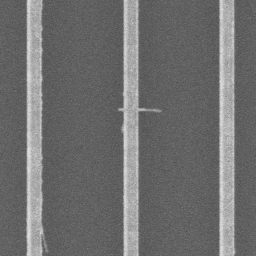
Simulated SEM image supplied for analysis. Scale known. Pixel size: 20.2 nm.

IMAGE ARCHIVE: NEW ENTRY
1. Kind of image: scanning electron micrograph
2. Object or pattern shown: lines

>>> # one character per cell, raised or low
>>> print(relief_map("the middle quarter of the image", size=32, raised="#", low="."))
...............###..............
...............###..............
...............###..............
...............###..............
...............###..............
...............###..............
...............###..............
...............###..............
...............###..............
...............###..............
...............###..............
..............#####.............
...............###..............
...............###..............
...............###..............
...............###..............
...............###..............
...............###..............
...............###..............
...............###..............
...............###..............
...............###..............
...............###..............
...............###..............
...............###..............
...............###..............
...............###..............
...............###..............
...............###..............
...............###..............
...............###..............
...............###..............